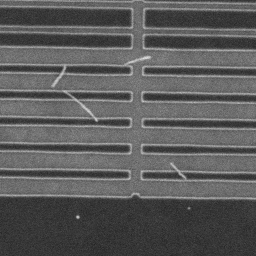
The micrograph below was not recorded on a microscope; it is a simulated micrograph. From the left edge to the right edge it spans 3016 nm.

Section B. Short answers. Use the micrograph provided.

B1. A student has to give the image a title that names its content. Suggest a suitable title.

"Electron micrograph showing groups of lines, slits or small figures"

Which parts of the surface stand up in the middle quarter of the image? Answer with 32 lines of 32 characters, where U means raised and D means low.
UUUUUUUUUUUUUUUUUDDDDDDDDDDDDDDD
UUUUUUUUUUUUUUUUUDDDUUUUUUUUUUUU
UUUUUUUUUUUUUUUUUDDDUUUUUUUUUUUU
DDDDDDDDDDDDDDDDDDDDDDDDDDDDDDDD
DDDDDDDDDDDDDDDDDDDDDDDDDDDDDDDD
DDDDDDDDDDDDDDDDDDDDDDDDDDDDDDDD
DDDDDDDDDDDDDDDDDDDDDDDDDDDDDDDD
UUUUUUUUUUUUUUUUUDDDUUUUUUUUUUUU
UUUUUUUUUUUUUUUUUDDDUUUUUUUUUUUU
DDDUDDDDDDDDDDDDDDDDUUUUUUUUUUUU
DDDDDDDDDDDDDDDDDDDDDDDDDDDDDDDD
DDDDDDDDDDDDDDDDDDDDDDDDDDDDDDDD
DDDDDDDDDDDDDDDDDDDDDDDDDDDDDDDD
UUDDDDDUDDDDDDDDDDDDDDDDDDDDDDDD
UUUUUUUUUUUUUUUUUDDDUUUUUUUUUUUU
DDUUUUUUUUUUUUUUUDDDUUUUUUUUUUUU
DDDDDDDDDDDDDDDDDDDDDDDDDDDDDDDD
DDDDDDDDDDDDDDDDDDDDDDDDDDDDDDDD
DDDDDDDDDDDDDDDDDDDDDDDDDDDDDDDD
DDDDDDDDDDDDDDDDDDDDDDDDDDDDDDDD
UUUUUUUUUUUUUUUUUDDUUUUUUUUUUUUU
UUUUUUUUUUUUUUUUUDDUUUUUUUUUUUUU
DDDDDDDDDDDDDDDDDDDDDDDUUUUUUUUU
DDDDDDDDDDDDDDDDDDDDDDDDDDDDDDDD
DDDDDDDDDDDDDDDDDDDDDDDDDDDDDDDD
DDDDDDDDDDDDDDDDDDDDDDDDDDDDDDDD
UUUUUUUUUUUUDDDDDDDDDDDDDDDDUDDD
UUUUUUUUUUUUUUUUDDDUUUUUUUUUUUUU
UUUUUUUUUUUUUUUUDDDUUUUUUUUUUUUU
DDDDDDDDDDDDDDDDDDDDDDDDDDDDDDDD
DDDDDDDDDDDDDDDDDDDDDDDDDDDDDDDD
DDDDDDDDDDDDDDDDDDDDDDDDDDDDDDDD